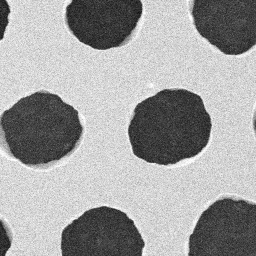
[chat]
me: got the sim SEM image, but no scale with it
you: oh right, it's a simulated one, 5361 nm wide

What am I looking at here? holes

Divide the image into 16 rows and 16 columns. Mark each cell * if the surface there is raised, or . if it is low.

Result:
.***.....***....
****.....***....
*****...*****...
****************
****************
****************
*...*****....***
.....***.....***
.....***.....***
.....***....****
****************
****************
**************.*
*****...*****...
.***.....***....
.***.....***....